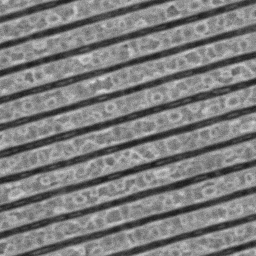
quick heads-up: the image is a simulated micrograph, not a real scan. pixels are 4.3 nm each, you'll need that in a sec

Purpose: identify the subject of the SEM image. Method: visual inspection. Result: parallel lines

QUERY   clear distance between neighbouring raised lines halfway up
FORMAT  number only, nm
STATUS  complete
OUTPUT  34.6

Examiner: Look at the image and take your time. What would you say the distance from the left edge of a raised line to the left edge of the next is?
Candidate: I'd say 112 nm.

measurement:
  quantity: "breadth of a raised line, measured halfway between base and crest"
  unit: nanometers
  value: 76.6